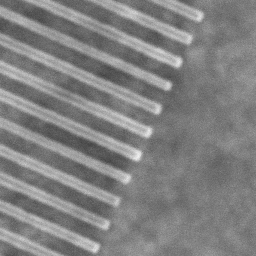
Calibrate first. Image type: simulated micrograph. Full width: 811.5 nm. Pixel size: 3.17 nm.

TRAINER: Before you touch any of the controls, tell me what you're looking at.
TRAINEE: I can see parallel lines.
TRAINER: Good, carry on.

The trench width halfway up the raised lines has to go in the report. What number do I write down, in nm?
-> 53.4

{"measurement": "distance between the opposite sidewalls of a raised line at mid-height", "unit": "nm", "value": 26.8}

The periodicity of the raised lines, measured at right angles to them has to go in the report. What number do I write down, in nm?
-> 80